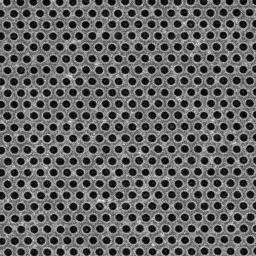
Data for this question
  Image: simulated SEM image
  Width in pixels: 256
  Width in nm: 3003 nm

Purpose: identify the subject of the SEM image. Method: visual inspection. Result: a regular array of holes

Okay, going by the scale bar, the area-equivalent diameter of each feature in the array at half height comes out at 0.0954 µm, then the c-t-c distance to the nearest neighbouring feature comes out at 150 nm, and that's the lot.